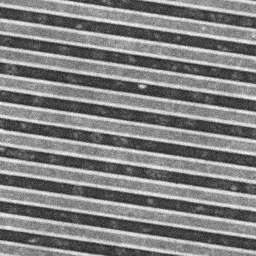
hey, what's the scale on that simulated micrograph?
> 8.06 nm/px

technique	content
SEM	parallel lines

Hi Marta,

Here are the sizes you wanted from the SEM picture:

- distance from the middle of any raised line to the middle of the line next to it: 27.4 px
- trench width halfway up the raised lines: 116 nm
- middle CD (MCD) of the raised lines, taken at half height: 99.7 nm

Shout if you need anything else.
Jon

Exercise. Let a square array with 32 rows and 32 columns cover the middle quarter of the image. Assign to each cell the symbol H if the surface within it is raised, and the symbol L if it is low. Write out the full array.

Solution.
HHHHHHHHHHHHHHLLLLLLLLLLLLLLLLLL
LHHHHHHHHHHHHHHHHHHHHLLLLLLLLLLL
LLLLLLLHHHHHHHHHHHHHHHHHHHHLLLLL
LLLLLLLLLLLLLLHHHHHHHHHHHHHHHHHH
LLLLLLLLLLLLLLLLLLLLLHHHHHHHHHHH
HLLLLLLLLLLLLLLLLLLLLLLLLLLHHHHH
HHHHHHHLLLLLLLLLLLLLLLLLLLLLLLLL
HHHHHHHHHHHHHHLLLLLLLLLLLLLLLLLL
LHHHHHHHHHHHHHHHHHHHHLLLLLLLLLLL
LLLLLLLHHHHHHHHHHHHHHHHHHHHLLLLL
LLLLLLLLLLLLLLHHHHHHHHHHHHHHHHHH
LLLLLLLLLLLLLLLLLLLLLHHHHHHHHHHH
HLLLLLLLLLLLLLLLLLLLLLLLLLLHHHHH
HHHHHHHHLLLLLLLLLLLLLLLLLLLLLLLL
HHHHHHHHHHHHHHLLLLLLLLLLLLLLLLLL
LHHHHHHHHHHHHHHHHHHHHLLLLLLLLLLL
LLLLLLLLHHHHHHHHHHHHHHHHHHHHLLLL
LLLLLLLLLLLLLLHHHHHHHHHHHHHHHHHH
LLLLLLLLLLLLLLLLLLLLLHHHHHHHHHHH
HLLLLLLLLLLLLLLLLLLLLLLLLLLLHHHH
HHHHHHHHLLLLLLLLLLLLLLLLLLLLLLLL
HHHHHHHHHHHHHHLLLLLLLLLLLLLLLLLL
LHHHHHHHHHHHHHHHHHHHHLLLLLLLLLLL
LLLLLLLLHHHHHHHHHHHHHHHHHHHHLLLL
LLLLLLLLLLLLLLHHHHHHHHHHHHHHHHHH
LLLLLLLLLLLLLLLLLLLLLHHHHHHHHHHH
HHLLLLLLLLLLLLLLLLLLLLLLLLLLHHHH
HHHHHHHHHLLLLLLLLLLLLLLLLLLLLLLL
HHHHHHHHHHHHHHHHLLLLLLLLLLLLLLLL
LLHHHHHHHHHHHHHHHHHHHHHLLLLLLLLL
LLLLLLLLLLHHHHHHHHHHHHHHHHHHLHLL
LLLLLLLLLLLLLLLLHHHHHHHHHHHHHHHH